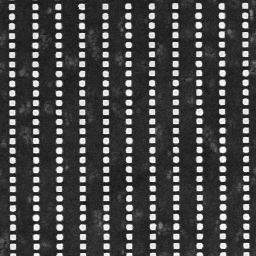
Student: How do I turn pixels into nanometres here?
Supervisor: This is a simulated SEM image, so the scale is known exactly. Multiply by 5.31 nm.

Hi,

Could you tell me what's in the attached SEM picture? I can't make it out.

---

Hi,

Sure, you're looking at a regular array of raised bodies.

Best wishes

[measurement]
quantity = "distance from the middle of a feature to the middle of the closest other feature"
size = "50.3 nanometres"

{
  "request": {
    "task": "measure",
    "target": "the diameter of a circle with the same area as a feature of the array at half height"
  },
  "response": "0.0328 um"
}